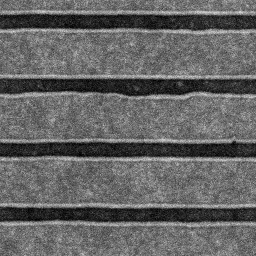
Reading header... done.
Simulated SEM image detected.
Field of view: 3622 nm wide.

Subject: one or a few lines or trenches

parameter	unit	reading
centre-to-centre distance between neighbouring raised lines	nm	908